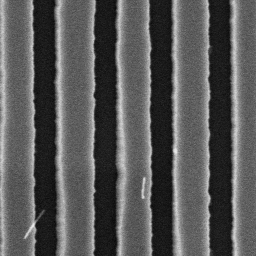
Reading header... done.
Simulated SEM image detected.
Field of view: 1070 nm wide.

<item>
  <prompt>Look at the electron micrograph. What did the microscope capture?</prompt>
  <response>lines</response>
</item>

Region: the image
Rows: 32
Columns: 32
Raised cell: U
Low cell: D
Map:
UUUUDDDUUUUUDDDUUUUDDDUUUUDDDUUU
UUUUDDDUUUUUDDDUUUUDDDUUUUDDDUUU
UUUUDDDUUUUUDDDUUUUDDDUUUUDDDUUU
UUUUDDDUUUUUDDDUUUUDDDUUUUDDDUUU
UUUUDDDUUUUUDDDUUUUDDDUUUUDDDUUU
UUUUDDDUUUUUDDDUUUUDDDUUUUDDDUUU
UUUUDDDUUUUUDDUUUUUDDDUUUUDDDUUU
UUUUDDDUUUUUDDDUUUUDDDUUUUDDDUUU
UUUUDDDUUUUUDDDUUUUDDDUUUUDDDUUU
UUUUDDDUUUUUDDDUUUUDDDUUUUDDDUUU
UUUUDDDUUUUUDDDUUUUDDDUUUUDDDUUU
UUUUDDDUUUUUDDDUUUUDDDUUUUDDDUUU
UUUUDDDUUUUUDDDUUUUDDDUUUUDDDUUU
UUUUDDDUUUUUDDDUUUUDDDUUUUDDDUUU
UUUUDDDUUUUUDDDUUUUDDDUUUUDDDUUU
UUUUDDDUUUUUDDDUUUUDDDUUUUDDDUUU
UUUUDDDUUUUUDDDUUUUDDDUUUUDDDUUU
UUUUDDDUUUUUDDDUUUUDDDUUUUDDDUUU
UUUUDDDUUUUUDDDUUUUDDDUUUUDDDUUU
UUUUDDDUUUUUDDDUUUUDDDUUUUDDDUUU
UUUUDDDUUUUUDDDUUUUDDDUUUUDDDUUU
UUUUDDDUUUUUDDDUUUUDDDUUUUDDDUUU
UUUUDDDUUUUUDDDUUUUDDDUUUUDDDUUU
UUUUDDDUUUUUDDDUUUUDDDUUUUDDDUUU
UUUUDDDUUUUUDDDUUUUDDDUUUUDDDUUU
UUUUDDDUUUUUDDDUUUUDDDUUUUDDDUUU
UUUUDDDUUUUUDDDUUUUDDDUUUUDDDUUU
UUUUDDDUUUUUDDDUUUUDDDUUUUDDDUUU
UUUUDDDUUUUUDDDUUUUDDDUUUUDDDUUU
UUUUDDDUUUUUDDDUUUUDDDUUUUDDDUUU
UUUUDDDUUUUUDDDUUUUDDDUUUUDDDUUU
UUUUDDDUUUUUDDDUUUUDDDUUUUDDDUUU